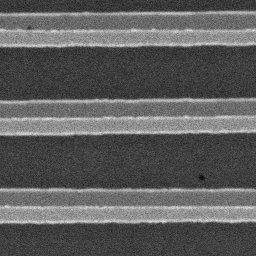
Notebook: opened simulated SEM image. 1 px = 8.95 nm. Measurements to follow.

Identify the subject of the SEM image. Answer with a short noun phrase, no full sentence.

lines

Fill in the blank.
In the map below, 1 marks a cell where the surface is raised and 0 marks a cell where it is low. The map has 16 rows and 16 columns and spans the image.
0000000000000000
1111111111111111
1111111111111111
0000000000000000
0000000000000000
0000000000000000
1111111111111111
1111111111111111
0000000000000000
0000000000000000
0000000000000000
0000000000000000
1111111111111111
1111111111111111
0000000000000000
0000000000000000